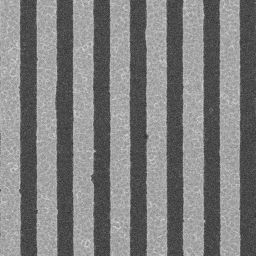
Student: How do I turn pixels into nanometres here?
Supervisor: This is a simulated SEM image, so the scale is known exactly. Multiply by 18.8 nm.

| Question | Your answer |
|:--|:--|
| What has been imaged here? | parallel lines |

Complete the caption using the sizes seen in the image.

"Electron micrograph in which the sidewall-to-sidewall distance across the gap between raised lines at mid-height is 0.316 micrometres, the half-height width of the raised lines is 366 nm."